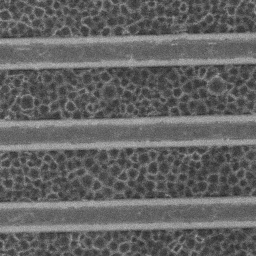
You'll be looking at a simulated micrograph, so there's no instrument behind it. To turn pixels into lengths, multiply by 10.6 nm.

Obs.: one or a few lines or trenches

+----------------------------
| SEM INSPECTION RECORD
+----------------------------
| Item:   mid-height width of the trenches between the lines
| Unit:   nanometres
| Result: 622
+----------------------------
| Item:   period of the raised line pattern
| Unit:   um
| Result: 0.865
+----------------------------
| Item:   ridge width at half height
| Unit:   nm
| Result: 245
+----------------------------